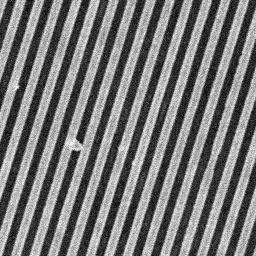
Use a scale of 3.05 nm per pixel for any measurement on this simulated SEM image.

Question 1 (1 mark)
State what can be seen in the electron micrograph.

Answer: parallel lines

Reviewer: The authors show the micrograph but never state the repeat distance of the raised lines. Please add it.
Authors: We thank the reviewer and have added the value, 54.2 nm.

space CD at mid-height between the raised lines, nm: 31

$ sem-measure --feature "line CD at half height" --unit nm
23.3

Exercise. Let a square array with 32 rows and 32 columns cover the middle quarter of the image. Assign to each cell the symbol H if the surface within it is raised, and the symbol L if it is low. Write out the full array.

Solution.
LLHHLLHHLLLHHLLLHHLLHHLLLHHLLLHH
LHHLLLHHLLLHHLLHHLLLHHLLLHHLLHHL
LHHLLLHHLLHHLLLHHLLLHHLLHHLLLHHL
LHHLLHHLLLHHLLLHHLLHHLLLHHLLLHHL
HHLLLHHLLLHHLLHHLLLHHLLLHHLLHHLL
HHLLLHHLLLHLLLHHLLLHHLLHHLLLHHLL
HHLLLHHLLHHLLLHHLLLHLLLHHLLLHHLL
HHLLHHLLLHHLLLHHLLHHLLLHHLLLHHLL
HLLLHHLLLHHLLHHLLLHHLLLHHLLHHLLL
HLLLHHLLHHLLLHHLLLHHLLHHLLLHHLLL
HLLHHLLLHHLLLHHLLHHLLLHHLLLHHLLH
LLLHHLLLHHLLHHLLLHHLLLHHLLHHLLLH
LLLHHLLHHLLLHHLLLHHLLHHLLLHHLLLH
LLHHLLLHHLLHHHLLHHLLLHHLLHHHLLHH
LLHHLLLHHLLHHLLLHHLLLHHLLHHLLLHH
LHHHLLHHLLLHHLLLHHLLHHLLLHHLLLHH
LHHLLLHHLLLHHLLHHLLLHHLLHHHLLHHL
LHHLLLHHLLHHLLLHHLLLHHLLHHLLLHHL
LHHLLHHLLLHHLLLHHLLHHLLLHHLLLHHL
HHHHLHHLLLHHLLHHLLLHHLLLHHLLHHLL
HHHHHHHLLHHLLLHHLLLHHLLHHLLLHHLL
HHLHHHLLLHHLLLHHLLHHLLLHHLLLHHLL
HHLLHHLLLHHLLLHHLLHHLLLHHLLLHLLL
HLLLHHLLHHHLLHHLLLHHLLLHHLLHHLLL
HLLLHHLLHHLLLHHLLHHHLLHHLLLHHLLH
HLLHHLLLHHLLLHHLLHHLLLHHLLHHHLLH
LLLHHLLLHHLLHHLLLHHLLLHHLLHHLLLH
LLLHHLLHHLLLHHLLLHHLLHHLLLHHLLLH
LLHHLLLHHLLLHHLLHHLLLHHLLHHHLLHH
LLHHLLLHHLLHHLLLHHLLLHHLLHHLLLHH
LLHHLLHHLLLHHLLLHHLLHHLLLHHLLLHH
LHHLLLHHLLLHHLLHHLLLHHLLHHHLLHHL